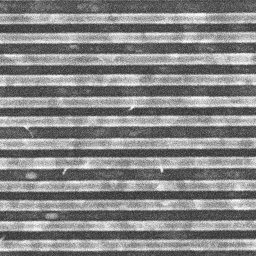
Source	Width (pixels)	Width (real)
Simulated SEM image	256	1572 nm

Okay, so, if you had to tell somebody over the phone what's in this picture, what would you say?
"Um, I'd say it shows parallel lines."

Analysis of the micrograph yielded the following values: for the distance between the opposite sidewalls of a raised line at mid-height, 9.51 pixels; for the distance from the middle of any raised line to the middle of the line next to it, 127 nm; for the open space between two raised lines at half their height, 69.1 nanometers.